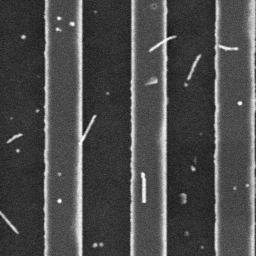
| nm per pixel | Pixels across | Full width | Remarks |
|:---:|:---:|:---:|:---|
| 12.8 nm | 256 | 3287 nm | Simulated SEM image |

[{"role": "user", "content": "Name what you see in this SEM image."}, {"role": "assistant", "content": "lines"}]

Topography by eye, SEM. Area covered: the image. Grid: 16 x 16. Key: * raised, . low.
...**...**....**
...**...**...***
...**...**...***
...**...**...***
...**...**...***
...**...**...***
...**...**...***
...**...**...***
...**...**...***
...**...**...***
...**...**...***
...**...**...***
...**...**...***
...**...**...***
...**...**...***
...**...**...***